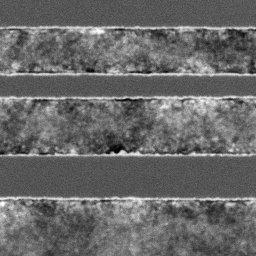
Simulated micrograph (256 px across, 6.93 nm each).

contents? lines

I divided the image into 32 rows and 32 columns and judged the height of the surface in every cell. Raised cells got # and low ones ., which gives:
################################
################################
################################
#..#.......##..########..#######
................................
................................
................................
................................
................................
################################
################################
################################
................................
................................
................................
................................
................................
................................
................................
################################
################################
################################
################################
################################
################################
................................
................................
................................
................................
................................
................................
................................